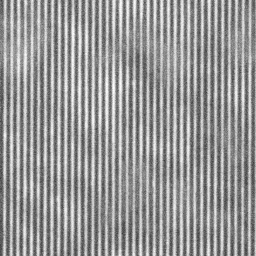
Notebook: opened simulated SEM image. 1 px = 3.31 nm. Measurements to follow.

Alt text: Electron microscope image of parallel lines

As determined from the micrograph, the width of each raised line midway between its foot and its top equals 6.2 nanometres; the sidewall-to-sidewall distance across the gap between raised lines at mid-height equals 4.98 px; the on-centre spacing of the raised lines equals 22.5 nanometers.